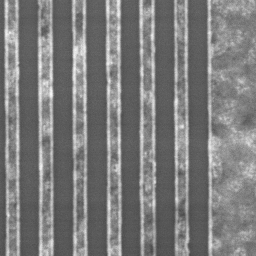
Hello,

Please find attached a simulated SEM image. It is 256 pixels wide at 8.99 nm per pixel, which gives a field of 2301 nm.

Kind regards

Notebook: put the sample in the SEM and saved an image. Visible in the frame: parallel lines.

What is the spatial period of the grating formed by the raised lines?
304 nm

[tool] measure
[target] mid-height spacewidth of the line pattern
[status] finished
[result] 204 nm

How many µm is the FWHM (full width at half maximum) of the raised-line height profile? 0.0989